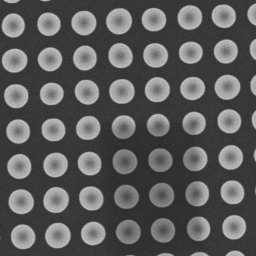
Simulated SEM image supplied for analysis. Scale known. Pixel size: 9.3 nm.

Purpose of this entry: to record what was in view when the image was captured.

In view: an array of small figures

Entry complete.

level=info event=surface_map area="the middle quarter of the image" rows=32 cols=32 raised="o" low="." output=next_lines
...ooooo....oooo.....ooo........
....oo..........................
................................
.......................oo......o
....ooo.....oooo.....ooooo....oo
...ooooo....ooooo...oooooo...ooo
...oooooo..oooooo...oooooo...ooo
...oooooo..ooooooo..oooooo...ooo
...oooooo...ooooo....ooooo....oo
....oooo.....ooo................
................................
................................
...............................o
....oooo.....oooo....ooooo....oo
....ooooo...oooooo...ooooo....oo
...oooooo...oooooo...ooooo....oo
...oooooo...oooooo...ooooo....oo
...oooooo....oooo.....ooo......o
....oooo......oo................
................................
................................
..............oo......ooo......o
.....ooo.....ooooo...oooooo...oo
o...ooooo...oooooo...oooooo...oo
o...ooooo...oooooo...oooooo...oo
o...ooooo...oooooo....ooooo...oo
o...ooooo....oooo.....oooo.....o
.....ooo......o.................
................................
................................
..............ooo.....ooooo....o
.....oooo....ooooo....ooooo....o